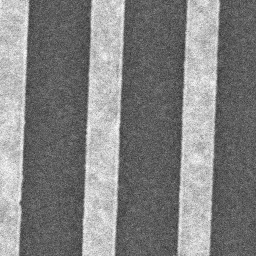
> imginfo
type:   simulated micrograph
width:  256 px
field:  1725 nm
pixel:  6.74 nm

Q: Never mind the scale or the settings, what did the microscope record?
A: one or a few lines or trenches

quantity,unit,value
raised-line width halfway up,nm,201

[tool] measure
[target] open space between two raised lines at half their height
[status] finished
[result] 436 nanometres